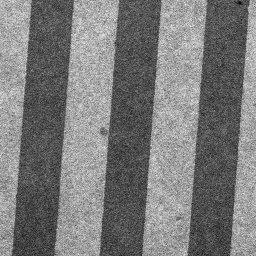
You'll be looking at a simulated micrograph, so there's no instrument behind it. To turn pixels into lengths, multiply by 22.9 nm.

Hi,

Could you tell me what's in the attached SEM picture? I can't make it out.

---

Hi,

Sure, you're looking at one or a few lines or trenches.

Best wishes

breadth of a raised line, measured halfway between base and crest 1010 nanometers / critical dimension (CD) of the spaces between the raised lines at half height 0.979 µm